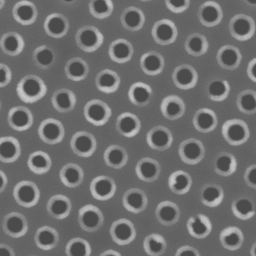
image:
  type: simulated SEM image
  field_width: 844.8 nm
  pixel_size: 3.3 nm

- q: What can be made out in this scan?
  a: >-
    a regular array of holes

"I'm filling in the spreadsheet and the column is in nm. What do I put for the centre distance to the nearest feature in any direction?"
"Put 110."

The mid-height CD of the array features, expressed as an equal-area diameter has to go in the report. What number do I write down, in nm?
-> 50.4